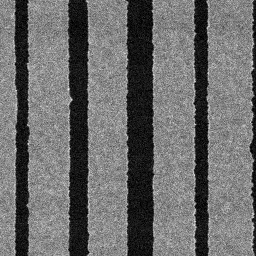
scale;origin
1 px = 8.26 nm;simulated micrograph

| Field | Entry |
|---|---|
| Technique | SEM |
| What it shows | one or a few lines or trenches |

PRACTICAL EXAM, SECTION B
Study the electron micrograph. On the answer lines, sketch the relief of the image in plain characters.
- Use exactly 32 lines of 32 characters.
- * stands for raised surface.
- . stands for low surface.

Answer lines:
**..*****..*****...*****..******
**..****...*****...*****..******
**..*****..*****...*****..******
**..****...*****...*****..******
**..*****..*****...*****..******
**..****...*****...*****..******
**..*****..*****...*****..******
**..*****..*****...*****..******
**.******..*****...*****..******
**..*****..*****...*****..*****.
**..*****..*****...*****..*****.
**..*****..*****...*****..******
**..*****..*****...*****..******
**..*****..*****...*****..******
**..*****..*****...*****..******
**..*****..*****...*****..******
**..*****..*****...*****..******
**..*****..*****...*****..*****.
**..*****..*****...*****..*****.
**..*****..*****...*****..*****.
**..*****..*****...*****..******
**..*****..*****...*****..******
**..*****..*****...*****..*****.
**..*****..*****...*****..*****.
**..*****..*****...*****..*****.
**..*****..*****...*****..******
**..*****..*****...*****..******
**..*****..*****...*****..******
**..*****..*****...*****..******
**..*****..*****...*****..******
**..*****..*****...*****..******
**..*****..*****...*****..******